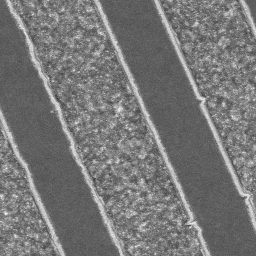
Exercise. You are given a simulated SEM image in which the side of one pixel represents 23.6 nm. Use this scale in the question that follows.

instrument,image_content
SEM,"one or a few lines or trenches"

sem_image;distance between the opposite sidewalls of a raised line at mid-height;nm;1280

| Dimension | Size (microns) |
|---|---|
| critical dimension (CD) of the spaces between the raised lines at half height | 1.88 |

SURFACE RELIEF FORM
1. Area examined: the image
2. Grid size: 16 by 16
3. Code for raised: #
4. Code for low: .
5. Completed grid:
#.....####.....#
#......###......
##.....####.....
##......###.....
###.....####....
###.....####....
####.....####...
####.....####...
.###......###...
.####.....####..
..###......###..
..####.....####.
..####.....####.
...####.....####
...####.....####
....###......###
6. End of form